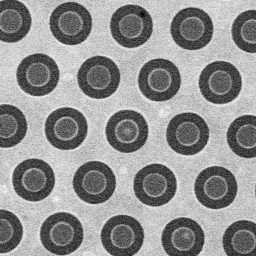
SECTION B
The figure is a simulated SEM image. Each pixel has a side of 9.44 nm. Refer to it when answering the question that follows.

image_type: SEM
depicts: an array of small figures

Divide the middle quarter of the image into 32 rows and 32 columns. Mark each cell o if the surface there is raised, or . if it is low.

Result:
oooo.........oooooo.........oooo
ooo....oooo...ooooo....oo....ooo
ooo...ooooo...oooo....oooo...ooo
ooo...oooooo..oooo...oooooo..ooo
ooo...ooooo...oooo...oooooo..ooo
oooo...oooo...oooo....oooo...ooo
oooo.........oooooo....oo....ooo
ooooo.......ooooooo.........oooo
oooooo.....ooooooooo.......ooooo
oooooooooooooooooooooo..oooooooo
.ooooooooooooooooooooooooooooooo
....oooooooooo....oooooooooooooo
.....ooooooo........ooooooooo...
oo....ooooo.........ooooooo.....
ooo...ooooo...ooo....ooooo......
ooo...oooo...ooooo...ooooo...ooo
ooo...oooo...ooooo...oooo...oooo
ooo...oooo...ooooo...oooo...oooo
oo...ooooo...ooooo...oooo...oooo
.....oooooo.....o...oooooo...ooo
....oooooooo........oooooo......
..ooooooooooo......oooooooo.....
oooooooooooooooooooooooooooo....
oooooooooooooooooooooooooooooooo
oooooo....oooooooooooooooooooooo
oooo.......ooooooooo......oooooo
ooo.........ooooooo........ooooo
ooo...ooo....ooooo..........oooo
oo...ooooo...oooo...ooooo...oooo
oo...ooooo...oooo...ooooo...oooo
oo...ooooo...oooo...ooooo....ooo
oo...ooooo...oooo...ooooo...oooo